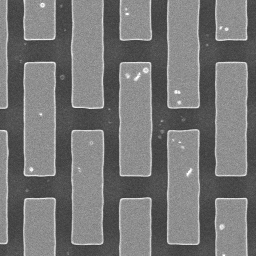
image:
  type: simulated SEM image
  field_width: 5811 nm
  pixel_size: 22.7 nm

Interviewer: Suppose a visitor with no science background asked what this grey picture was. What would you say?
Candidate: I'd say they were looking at groups of lines, slits or small figures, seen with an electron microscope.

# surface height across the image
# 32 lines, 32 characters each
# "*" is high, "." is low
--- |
*..****..****..****..****..****.
*..****..****..****..****..****.
*..****..****..****..****..****.
*..****..****..****..****..****.
*..****..****..****..****..****.
*........****........****.......
*........****........****.......
*........****........****.......
*..****..****..****..****..****.
*..****..****..****..****..****.
*..****..****..****..****..****.
*..****..****..****..****..****.
*..****..****..****..****..****.
*..****...***..****..****..****.
...****........****........****.
...****........****........****.
*..****..****..****..****..****.
*..****..****..****..****..****.
*..****..****..****..****..****.
*..****..****..****..****..****.
*..****..****..****..****..****.
*..****..****..****..****..****.
*........****........****.......
*........****........****.......
*........****........****.......
*..****..****..****..****..****.
*..****..****..****..****..****.
*..****..****..****..****..****.
*..****..****..****..****..****.
*..****..****..****..****..****.
...****..****..****..****..****.
...****........****........****.